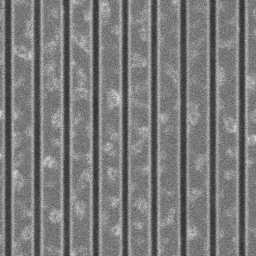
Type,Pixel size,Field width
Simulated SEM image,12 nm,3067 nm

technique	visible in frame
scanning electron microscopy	parallel lines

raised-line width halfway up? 21.6 px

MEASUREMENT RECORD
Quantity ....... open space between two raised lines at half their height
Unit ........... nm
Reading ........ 86.9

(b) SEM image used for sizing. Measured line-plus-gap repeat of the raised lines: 350 nm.